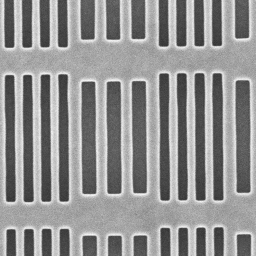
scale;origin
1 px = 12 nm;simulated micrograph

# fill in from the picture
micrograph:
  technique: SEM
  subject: groups of lines, slits or small figures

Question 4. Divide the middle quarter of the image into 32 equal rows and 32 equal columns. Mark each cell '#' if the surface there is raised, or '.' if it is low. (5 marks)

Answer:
################################
################################
########################..##...#
.#######################..##...#
.####...###...###...####..##...#
.###....##....###....###..##...#
.###....##....###....###..##...#
.###....##....###....###..##...#
.###....##....###....###..##...#
.###....##....###....###..##...#
.###....##....###....###..##...#
.###....##....###....###..##...#
.###....##....###....###..##...#
.###....##....###....###..##...#
.###....##....###....###..##...#
.###....##....###....###..##...#
.###....##....###....###..##...#
.###....###...###....###..##...#
.###....###...###....###..##...#
.###....###...###....###..##...#
.###....###...###....###..##...#
.###....###...###....###...#...#
.###....###...###....###...#...#
.###....###...###....###...#...#
.###....##....###....###...#...#
.###....##.....##....###...#...#
.###....##.....##....###...#...#
.###....##.....##....###...#...#
.###....###....##....###...#...#
.###....###....##....###...#...#
.###....###....##....###...#...#
.###....###...###....###...#...#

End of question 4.